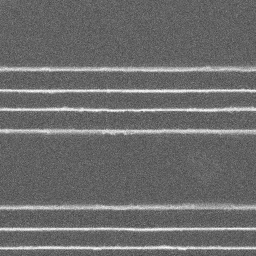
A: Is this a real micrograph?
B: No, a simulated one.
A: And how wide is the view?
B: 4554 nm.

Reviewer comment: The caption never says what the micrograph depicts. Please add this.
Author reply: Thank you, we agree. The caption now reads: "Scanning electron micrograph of lines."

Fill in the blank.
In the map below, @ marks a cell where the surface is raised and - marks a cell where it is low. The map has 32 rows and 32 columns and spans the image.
@@@@@@@@@@@@@@@@@@@@@@@@@@@@@@@@
@@@@@@@@@@@@@@@@@@@@@@@@@@@@@@@@
@@@@@@@@@@@@@@@@@@@@@@@@@@@@@@@@
@@@@@@@@@@@@@@@@@@@@@@@@@@@@@@@@
@@@@@@@@@@@@@@@@@@@@@@@@@@@@@@@@
@@@@@@@@@@@@@@@@@@@@@@@@@@@@@@@@
@@@@@@@@@@@@@@@@@@@@@@@@@@@@@@@@
@@@@@@@@@@@@@@@@@@@@@@@@@@@@@@@@
@@@@@@@@@@@@@@@@@@@@@@@@@@@@@@@@
--------------------------------
--------------------------------
@@@@@@@@@@@@@@@@@@@@@@@@@@@@@@@@
@@@@@@@@@@@@@@@@@@@@@@@@@@@@@@@@
@@@@@@@@@@@@@@@@@@@@@@@@@@@@@@@@
--------------------------------
--------------------------------
@@@@@@@@@@@@@@@@@@@@@@@@@@@@@@@@
@@@@@@@@@@@@@@@@@@@@@@@@@@@@@@@@
@@@@@@@@@@@@@@@@@@@@@@@@@@@@@@@@
@@@@@@@@@@@@@@@@@@@@@@@@@@@@@@@@
@@@@@@@@@@@@@@@@@@@@@@@@@@@@@@@@
@@@@@@@@@@@@@@@@@@@@@@@@@@@@@@@@
@@@@@@@@@@@@@@@@@@@@@@@@@@@@@@@@
@@@@@@@@@@@@@@@@@@@@@@@@@@@@@@@@
@@@@@@@@@@@@@@@@@@@@@@@@@@@@@@@@
@@@@@@@@@@@@@@@@@@@@@@@@@@@@@@@@
--------------------------------
--------------------------------
--------------------------------
@@@@@@@@@@@@@@@@@@@@@@@@@@@@@@@@
@@@@@@@@@@@@@@@@@@@@@@@@@@@@@@@@
--------------------------------